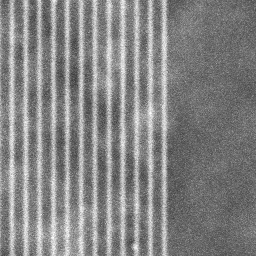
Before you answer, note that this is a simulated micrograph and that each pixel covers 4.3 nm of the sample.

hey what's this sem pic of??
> parallel lines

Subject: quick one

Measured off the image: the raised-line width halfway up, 10.8 nm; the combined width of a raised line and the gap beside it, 59.7 nm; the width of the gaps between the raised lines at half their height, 47.9 nm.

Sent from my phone